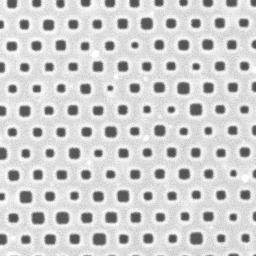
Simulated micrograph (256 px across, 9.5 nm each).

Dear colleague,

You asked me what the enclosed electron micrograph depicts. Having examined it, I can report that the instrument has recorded a regular array of holes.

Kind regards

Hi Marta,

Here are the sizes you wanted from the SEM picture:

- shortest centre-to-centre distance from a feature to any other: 229 nanometers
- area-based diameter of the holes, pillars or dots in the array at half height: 110 nm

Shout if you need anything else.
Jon